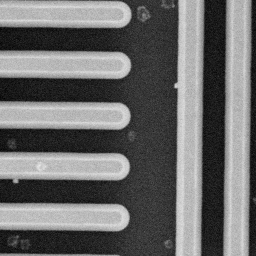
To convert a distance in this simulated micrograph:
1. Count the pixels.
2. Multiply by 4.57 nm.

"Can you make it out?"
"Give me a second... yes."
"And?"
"groups of lines, slits or small figures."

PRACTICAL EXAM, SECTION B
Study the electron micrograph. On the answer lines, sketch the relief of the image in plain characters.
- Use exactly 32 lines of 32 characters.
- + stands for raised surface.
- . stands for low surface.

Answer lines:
+++....................++....++.
++++++++++++++++.......++....++.
++++++++++++++++.......++....++.
.......................++....++.
.......................++....++.
.......................++....++.
.......................++....++.
++++++++++++++++.......++....++.
++++++++++++++++.......++....++.
.......................++....++.
.......................++....++.
.......................++....++.
.......................++....++.
+++++++++++++++........++....++.
++++++++++++++++.......++....++.
+++++++++++++++........++....++.
.......................++....++.
.......................++....++.
.......................++....++.
+++++++++..............++....++.
++++++++++++++++.......++...+++.
++++++++++++++++.......++...+++.
......................+++...+++.
......................+++...+++.
......................+++...+++.
......................+++...+++.
++++++++++++++++......+++...+++.
++++++++++++++++......+++...+++.
......................+++...+++.
......................+++...+++.
......................+++...+++.
......................+++...+++.